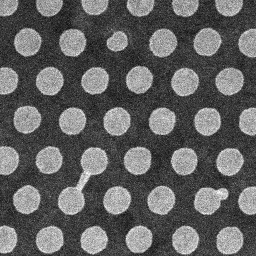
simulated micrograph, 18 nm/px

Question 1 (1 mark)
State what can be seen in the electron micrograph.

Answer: a regular array of raised bodies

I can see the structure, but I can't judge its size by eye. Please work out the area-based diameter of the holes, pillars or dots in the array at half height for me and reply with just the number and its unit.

479 nm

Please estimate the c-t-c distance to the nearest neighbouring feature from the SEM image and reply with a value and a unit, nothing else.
798 nanometres